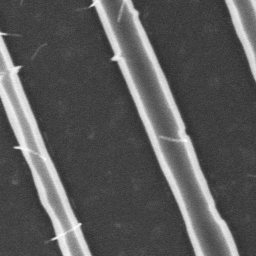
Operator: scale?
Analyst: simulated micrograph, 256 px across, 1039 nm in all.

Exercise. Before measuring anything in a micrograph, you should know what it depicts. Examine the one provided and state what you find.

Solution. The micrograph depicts one or a few lines or trenches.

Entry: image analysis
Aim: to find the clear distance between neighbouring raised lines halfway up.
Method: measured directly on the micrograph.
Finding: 422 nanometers